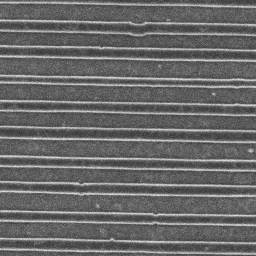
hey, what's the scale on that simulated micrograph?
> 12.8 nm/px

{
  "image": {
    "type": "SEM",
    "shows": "parallel lines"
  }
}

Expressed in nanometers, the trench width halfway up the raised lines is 222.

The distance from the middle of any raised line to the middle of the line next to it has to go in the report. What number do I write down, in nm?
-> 349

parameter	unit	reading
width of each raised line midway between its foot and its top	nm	133